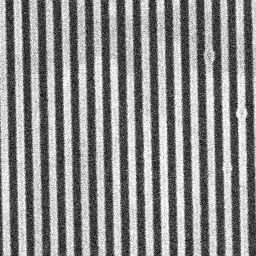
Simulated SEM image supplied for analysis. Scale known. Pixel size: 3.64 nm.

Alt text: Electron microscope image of parallel lines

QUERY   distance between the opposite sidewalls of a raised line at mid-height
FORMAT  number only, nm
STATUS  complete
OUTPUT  21.8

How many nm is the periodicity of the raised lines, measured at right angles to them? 57.8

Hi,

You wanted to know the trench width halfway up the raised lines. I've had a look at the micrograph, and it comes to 34.1 nanometres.